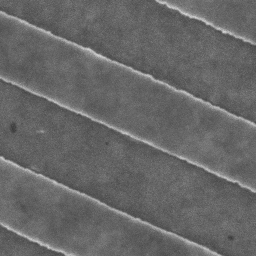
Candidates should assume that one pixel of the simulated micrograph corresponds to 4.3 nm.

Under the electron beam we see one or a few lines or trenches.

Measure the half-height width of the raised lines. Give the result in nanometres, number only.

267